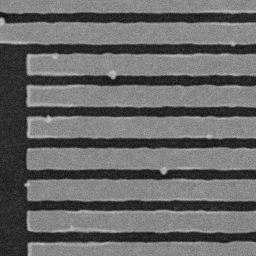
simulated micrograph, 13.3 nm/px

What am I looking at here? groups of lines, slits or small figures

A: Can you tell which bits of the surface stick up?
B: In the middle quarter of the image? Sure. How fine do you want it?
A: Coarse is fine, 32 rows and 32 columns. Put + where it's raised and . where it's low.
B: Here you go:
++++++++++++++++++++++++++++++++
++++++++++++++++++++++++++++++++
++++++++++++++++++++++++++++++++
............+...................
................................
...+++++......+++++.............
++++++++++++++++++++++++++++++++
++++++++++++++++++++++++++++++++
++++++++++++++++++++++++++++++++
++++++++++++++++++++++++++++++++
.................+++++++........
................................
................................
.+++++++++++..++++++++++++++++++
++++++++++++++++++++++++++++++++
++++++++++++++++++++++++++++++++
++++++++++++++++++++++++++++++++
++++++++++++++++++++++++++++++++
................................
................................
................................
++++++++++++++++++++++++++++++++
++++++++++++++++++++++++++++++++
++++++++++++++++++++++++++++++++
++++++++++++++++++++++++++++++++
++++++++++++++++++++++++++++++++
........................++......
................................
................................
++++++++++++++++++++++++++++++++
++++++++++++++++++++++++++++++++
++++++++++++++++++++++++++++++++